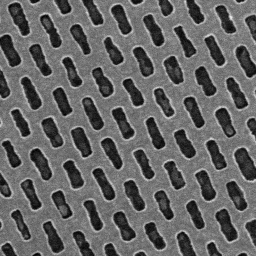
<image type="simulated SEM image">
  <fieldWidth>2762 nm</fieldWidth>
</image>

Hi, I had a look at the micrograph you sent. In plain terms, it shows a regular array of holes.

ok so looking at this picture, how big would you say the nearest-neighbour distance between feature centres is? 337 nm